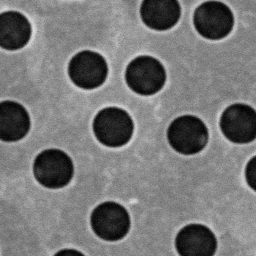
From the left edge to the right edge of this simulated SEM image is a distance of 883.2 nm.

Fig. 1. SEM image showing holes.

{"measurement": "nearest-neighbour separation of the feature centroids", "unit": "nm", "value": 230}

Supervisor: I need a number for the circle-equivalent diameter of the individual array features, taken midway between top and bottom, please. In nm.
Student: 145